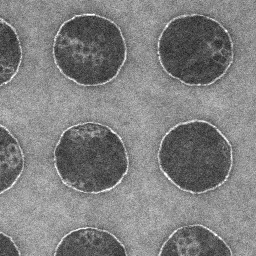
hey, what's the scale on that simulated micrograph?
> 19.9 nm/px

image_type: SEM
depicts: raised bodies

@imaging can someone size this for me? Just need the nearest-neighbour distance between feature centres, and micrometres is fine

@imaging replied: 2.09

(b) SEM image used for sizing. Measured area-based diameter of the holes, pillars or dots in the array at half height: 1440 nm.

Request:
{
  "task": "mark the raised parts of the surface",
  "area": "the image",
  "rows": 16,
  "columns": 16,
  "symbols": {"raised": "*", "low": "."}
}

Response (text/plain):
................
....***....***..
*..*****..****..
*..*****..*****.
*...***...****..
................
................
................
*...***...****..
*..*****..****..
*...****..****..
*...***....***..
................
................
.....**....**...
*...****..****..